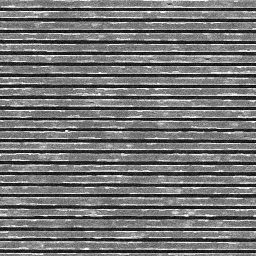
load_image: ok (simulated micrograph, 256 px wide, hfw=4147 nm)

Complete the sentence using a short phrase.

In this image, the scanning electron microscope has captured parallel lines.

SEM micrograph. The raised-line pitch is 0.178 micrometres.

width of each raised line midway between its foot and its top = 115 nm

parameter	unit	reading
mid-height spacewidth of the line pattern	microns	0.0567